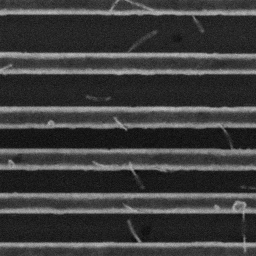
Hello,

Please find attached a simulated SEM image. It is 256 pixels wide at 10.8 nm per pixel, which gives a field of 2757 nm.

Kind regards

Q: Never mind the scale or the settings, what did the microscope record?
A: lines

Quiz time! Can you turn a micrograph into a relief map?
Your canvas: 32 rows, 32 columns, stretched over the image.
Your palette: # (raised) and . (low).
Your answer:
################################
################################
................................
................................
................................
................................
................................
################################
################################
................................
................................
................................
................................
................................
################################
################################
................................
................................
................................
################################
################################
................................
................................
................................
################################
################################
......###........###..........#.
................................
................................
................................
......#.....###..#.....######.#.
################################